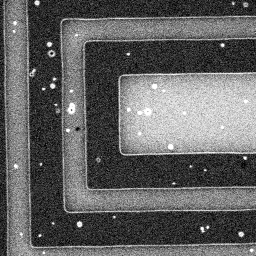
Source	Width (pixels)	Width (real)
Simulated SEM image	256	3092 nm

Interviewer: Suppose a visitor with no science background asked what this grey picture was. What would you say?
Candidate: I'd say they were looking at groups of lines, slits or small figures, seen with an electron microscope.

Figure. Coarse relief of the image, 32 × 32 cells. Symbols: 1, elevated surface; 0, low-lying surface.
00011111111111111111111111111111
00011111111111111111111111111111
00011111000000000000000000000000
00011111000000000000000000000000
10011111000000000000000000000000
10011111000111111111111111111111
10011111001111111111111111111111
10011111001111111111111111111111
10011111001111111111111111111111
10011111001111110000000000000000
10011111000111100000000000000000
10011111000111100000000000000000
10001111000111100000000000000000
10001111000111100000000000000000
10011111000111100000000000000000
10001111000111100000000000000000
10001111000111100000000000000000
10001111000111100000000000000000
10001111000111100000000000000000
10001111000111111111111111111111
10001111000111111111111111111111
10001111000111111111111111111111
10001111000111111111111111111111
10001111000111111111111110000000
10001111000000000000000000000000
10001111000000000000000000000000
10001111100011111111111111111111
10001111111111111111111111111111
10001111111111111111111111111111
10001111111111111111111111111111
10001111111111111111111111111110
10000000000000000000000000000000